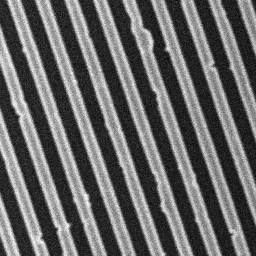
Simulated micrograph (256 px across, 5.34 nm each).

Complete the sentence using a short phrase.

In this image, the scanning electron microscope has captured parallel lines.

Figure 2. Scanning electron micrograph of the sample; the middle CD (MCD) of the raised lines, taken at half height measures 60 nanometres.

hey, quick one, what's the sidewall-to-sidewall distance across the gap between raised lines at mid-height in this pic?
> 84.6 nanometers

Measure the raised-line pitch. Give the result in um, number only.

0.145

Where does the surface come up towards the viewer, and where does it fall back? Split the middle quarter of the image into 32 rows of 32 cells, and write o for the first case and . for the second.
oo....ooo....ooo....ooo.....oo..
oo....ooo.....oo.....ooo....ooo.
oo.....ooo....ooo....ooo....ooo.
ooo....ooo....ooo....ooo....ooo.
ooo....ooo.....oo.....ooo....ooo
ooo....oooo....ooo....ooo....ooo
.ooo....ooo....ooo.....oo.....oo
.ooo....ooo....ooo.....ooo....oo
..oo....oooo....ooo....ooo....oo
..ooo....ooo....ooo.....oo.....o
..ooo....ooo....oooo....ooo....o
..ooo....oooo....ooo....ooo....o
...ooo....ooo....ooo....ooo.....
...ooo....ooo....oooo....ooo....
...ooo....oooo....ooo....ooo....
....ooo...oooo....ooo....ooo....
....ooo....ooo....oooo....ooo...
....ooo....oooo....ooo....ooo...
o....ooo....ooo....ooo....ooo...
o....ooo....ooo....oooo....ooo..
o....oooo....ooo....ooo....ooo..
oo....ooo....ooo....ooo....ooo..
oo....ooo....ooo.....ooo....ooo.
oo....ooo.....ooo....ooo....ooo.
ooo....ooo....ooo....ooo....ooo.
ooo....ooo....ooo.....ooo....ooo
ooo....oooo....ooo....ooo....ooo
.ooo....ooo....ooo.....oo....ooo
.ooo....ooo....ooo.....ooo....oo
.ooo....oooo....ooo....ooo....oo
..ooo....ooo....ooo.....oo....oo
..ooo....ooo....ooo.....ooo....o